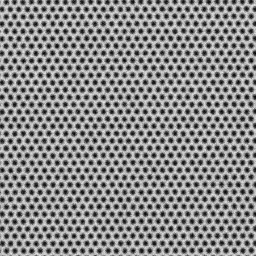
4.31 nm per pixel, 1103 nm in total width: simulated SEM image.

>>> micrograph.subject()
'a regular array of holes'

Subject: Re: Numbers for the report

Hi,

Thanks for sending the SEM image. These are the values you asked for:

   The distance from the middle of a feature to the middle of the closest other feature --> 34.6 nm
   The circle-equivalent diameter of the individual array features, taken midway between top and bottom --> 23.8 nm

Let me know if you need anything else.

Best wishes